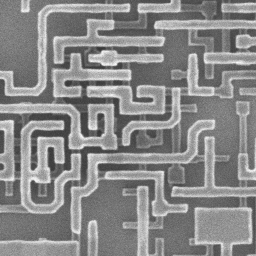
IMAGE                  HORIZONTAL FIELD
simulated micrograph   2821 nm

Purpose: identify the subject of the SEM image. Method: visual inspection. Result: wiring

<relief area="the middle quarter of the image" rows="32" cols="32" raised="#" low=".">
..##...........................#
.##########...##...............#
#################..............#
#################..............#
...............................#
...................###.........#
####..###########.#######..##..#
####..###########.#######..##..#
..............###.....###..##...
..............###.....###..##...
##....######..###########..##...
###...######..###########..##...
.###..##..##....##.........##...
..##..##..##...............##...
..##..##..##.....#######.####...
..##..##..##...############.....
..##......##...###.............#
..##......##...##..............#
.####.#######..#...............#
.############..#...............#
.####....####..................#
...............................#
..............#...............##
..##..##########################
..##..#########################.
..##..##........................
.###..##........................
####..##..###############.......
####..##...##############.......
#.....##...............##.......
.....###...............##.......
..######...........##..##..#####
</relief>